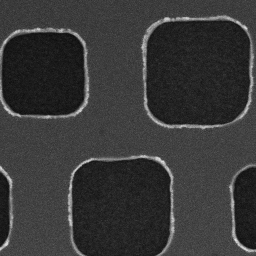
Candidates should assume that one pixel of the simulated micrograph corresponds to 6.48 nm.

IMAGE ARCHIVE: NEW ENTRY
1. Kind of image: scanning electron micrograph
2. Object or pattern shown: holes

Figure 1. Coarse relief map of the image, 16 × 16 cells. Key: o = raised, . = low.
oooooooooooooooo
oooooooooo.....o
o....oooo.......
.....oooo.......
.....oooo.......
.....oooo.......
.....oooo......o
oooooooooo.....o
oooooooooooooooo
oooooooooooooooo
ooooo.....oooooo
.oooo......oooo.
.ooo.......oooo.
.ooo.......oooo.
.oooo......oooo.
ooooo.....oooooo